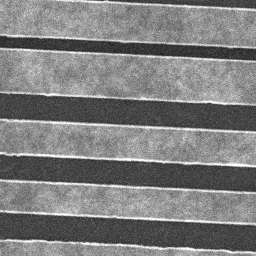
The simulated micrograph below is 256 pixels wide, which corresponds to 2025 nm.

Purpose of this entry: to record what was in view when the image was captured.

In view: one or a few lines or trenches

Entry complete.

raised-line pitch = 60.8 px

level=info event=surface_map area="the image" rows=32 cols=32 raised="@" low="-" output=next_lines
@@@@@@@@@@@@@@@@@---------------
@@@@@@@@@@@@@@@@@@@@@@@@@@@@@@@@
@@@@@@@@@@@@@@@@@@@@@@@@@@@@@@@@
@@@@@@@@@@@@@@@@@@@@@@@@@@@@@@@@
---@@@@@@@@@@@@@@@@@@@@@@@@@@@@@
-----------------------@@@@@@@@@
@@@@@@@@------------------------
@@@@@@@@@@@@@@@@@@@@@@@@@@@@----
@@@@@@@@@@@@@@@@@@@@@@@@@@@@@@@@
@@@@@@@@@@@@@@@@@@@@@@@@@@@@@@@@
@@@@@@@@@@@@@@@@@@@@@@@@@@@@@@@@
@@@@@@@@@@@@@@@@@@@@@@@@@@@@@@@@
--------------------@@@@@@@@@@@@
--------------------------------
--------------------------------
@@@@@@@@@-----------------------
@@@@@@@@@@@@@@@@@@@@@@@@@@@@@---
@@@@@@@@@@@@@@@@@@@@@@@@@@@@@@@@
@@@@@@@@@@@@@@@@@@@@@@@@@@@@@@@@
-------@@@@@@@@@@@@@@@@@@@@@@@@@
--------------------------@@@@@@
--------------------------------
--------------------------------
@@@@@@@@@@@@@@@@@---------------
@@@@@@@@@@@@@@@@@@@@@@@@@@@@@@@@
@@@@@@@@@@@@@@@@@@@@@@@@@@@@@@@@
--@@@@@@@@@@@@@@@@@@@@@@@@@@@@@@
---------------------@@@@@@@@@@@
--------------------------------
--------------------------------
@@@@@@@@@@@@--------------------
@@@@@@@@@@@@@@@@@@@@@@@@@@@@@---